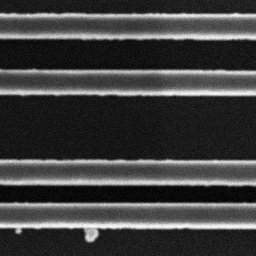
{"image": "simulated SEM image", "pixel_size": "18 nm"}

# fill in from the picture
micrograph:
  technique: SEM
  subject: lines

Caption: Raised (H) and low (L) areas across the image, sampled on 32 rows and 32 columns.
LLLLLLLLLLLLLLLLLLLLLLLLLLLLLLLL
LLLLLLLLLLLLLLLLLLLLLLLLLLLLLLLL
HHHHHHHHHHHHHHHHHHHHHHHHHHHHHHHH
HHHHHHHHHHHHHHHHHHHHHHHHHHHHHHHH
HHHHHHHHHHHHHHHHHHHHHHHHHHHHHHHH
LLLLLLLLLLLLLLLLLLLLLLLLLLLLLLLL
LLLLLLLLLLLLLLLLLLLLLLLLLLLLLLLL
LLLLLLLLLLLLLLLLLLLLLLLLLLLLLLLL
LLLLLLLLLLLLLLLLLLLLLLLLLLLLLLLL
HHHHHHHHHHHHHHHHHHHHHHHHHHHHHHHH
HHHHHHHHHHHHHHHHHHHHHHHHHHHHHHHH
HHHHHHHHHHHHHHHHHHHHHHHHHHHHHHHH
LLLLLLLLLLLLLLLLLLLLLLLLLLLLLLLL
LLLLLLLLLLLLLLLLLLLLLLLLLLLLLLLL
LLLLLLLLLLLLLLLLLLLLLLLLLLLLLLLL
LLLLLLLLLLLLLLLLLLLLLLLLLLLLLLLL
LLLLLLLLLLLLLLLLLLLLLLLLLLLLLLLL
LLLLLLLLLLLLLLLLLLLLLLLLLLLLLLLL
LLLLLLLLLLLLLLLLLLLLLLLLLLLLLLLL
LLLLLLLLLLLLLLLLLLLLLLLLLLLLLLLL
HHHHHHHHHHHHHHHHHHHHHHHHHHHHHHHH
HHHHHHHHHHHHHHHHHHHHHHHHHHHHHHHH
HHHHHHHHHHHHHHHHHHHHHHHHHHHHHHHH
LLLLLLLLLLLLLLLLLLLLLLLLLLLLLLLL
LLLLLLLLLLLLLLLLLLLLLLLLLLLLLLLL
HHHHHHHHHHHHHHHHHHHHHHHHHHHHHHHH
HHHHHHHHHHHHHHHHHHHHHHHHHHHHHHHH
HHHHHHHHHHHHHHHHHHHHHHHHHHHHHHHH
LLLLLLLLLLLLLLLLLLLLHLLLHLLLHLHH
LLLLLLLLLLLLLLLLLLLLLLLLLLLLLLLL
LLLLLLLLLLLLLLLLLLLLLLLLLLLLLLLL
LLLLLLLLLLLLLLLLLLLLLLLLLLLLLLLL